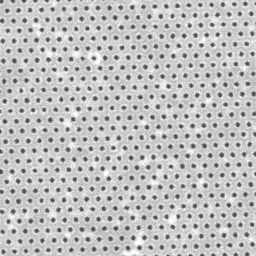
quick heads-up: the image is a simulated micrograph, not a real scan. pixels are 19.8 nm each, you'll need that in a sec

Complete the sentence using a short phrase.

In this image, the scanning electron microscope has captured a regular array of holes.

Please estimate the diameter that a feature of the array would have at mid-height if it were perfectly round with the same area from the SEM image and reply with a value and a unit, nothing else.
112 nanometers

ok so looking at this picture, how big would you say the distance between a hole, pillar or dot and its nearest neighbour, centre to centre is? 218 nm